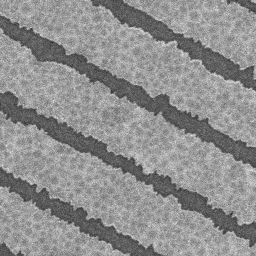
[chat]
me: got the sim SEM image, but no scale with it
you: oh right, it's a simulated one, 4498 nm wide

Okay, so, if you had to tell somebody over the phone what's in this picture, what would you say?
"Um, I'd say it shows one or a few lines or trenches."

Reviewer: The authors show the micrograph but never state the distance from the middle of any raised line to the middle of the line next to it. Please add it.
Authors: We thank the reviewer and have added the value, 1170 nm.